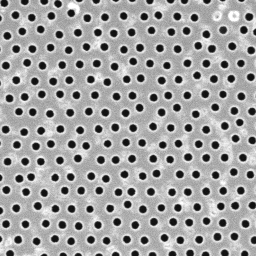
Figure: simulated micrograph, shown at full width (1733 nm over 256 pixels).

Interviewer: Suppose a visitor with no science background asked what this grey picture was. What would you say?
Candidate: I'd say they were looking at a regular array of holes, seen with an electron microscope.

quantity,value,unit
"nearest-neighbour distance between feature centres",0.107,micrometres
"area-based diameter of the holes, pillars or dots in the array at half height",0.0551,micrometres